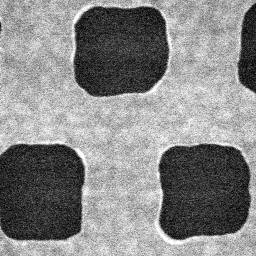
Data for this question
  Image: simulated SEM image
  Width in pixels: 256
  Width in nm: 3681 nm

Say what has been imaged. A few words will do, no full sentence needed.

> holes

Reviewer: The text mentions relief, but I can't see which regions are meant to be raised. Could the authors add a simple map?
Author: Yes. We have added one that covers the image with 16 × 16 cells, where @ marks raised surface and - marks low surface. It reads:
@@@@@@----@@@@@@
@@@@@-----@@@@@-
@@@@@-----@@@@@-
@@@@@------@@@@-
@@@@@-----@@@@@-
@@@@@-----@@@@@-
@@@@@@@@@@@@@@@@
@@@@@@@@@@@@@@@@
@@@@@@@@@@@@@@@@
-----@@@@@-----@
-----@@@@@------
-----@@@@@------
-----@@@@@------
-----@@@@@-----@
-----@@@@@-----@
@@@@@@@@@@@@@@@@